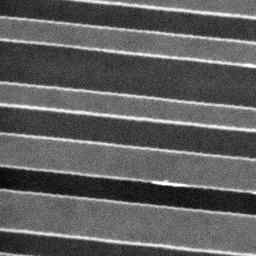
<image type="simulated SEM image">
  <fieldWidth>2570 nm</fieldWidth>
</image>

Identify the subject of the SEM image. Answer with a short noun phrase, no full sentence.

lines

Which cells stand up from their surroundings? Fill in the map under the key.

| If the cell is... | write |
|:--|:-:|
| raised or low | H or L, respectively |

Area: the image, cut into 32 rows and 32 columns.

LLLLLLLLLLLLLLLHHHHHHHHHHHHHHHHH
LLLLLLLLLLLLLLLLLLLLLLLLHHHHHHHH
HHHHLLLLLLLLLLLLLLLLLLLLLLLLLLLL
HHHHHHHHHHHHHLLLLLLLLLLLLLLLLLLL
HHHHHHHHHHHHHHHHHHHHHHHLLLLLLLLL
LLLLLLHHHHHHHHHHHHHHHHHHHHHHHHHH
LLLLLLLLLLLLLLLHHHHHHHHHHHHHHHHH
LLLLLLLLLLLLLLLLLLLLLLLLLHHHHHHH
LLLLLLLLLLLLLLLLLLLLLLLLLLLLLLLL
LLLLLLLLLLLLLLLLLLLLLLLLLLLLLLLL
HHLLLLLLLLLLLLLLLLLLLLLLLLLLLLLL
HHHHHHHHHHHHLLLLLLLLLLLLLLLLLLLL
HHHHHHHHHHHHHHHHHHHHHLLLLLLLLLLL
LLLLLHHHHHHHHHHHHHHHHHHHHHHHHHHL
LLLLLLLLLLLLLLHHHHHHHHHHHHHHHHHH
LLLLLLLLLLLLLLLLLLLLLLLLHHHHHHHH
LLLLLLLLLLLLLLLLLLLLLLLLLLLLLLLL
HHHHHHHHLLLLLLLLLLLLLLLLLLLLLLLL
HHHHHHHHHHHHHHHHHLLLLLLLLLLLLLLL
HHHHHHHHHHHHHHHHHHHHHHHHHHHLLLLL
HHHHHHHHHHHHHHHHHHHHHHHHHHHHHHHH
LLLLLLLHHHHHHHHHHHHHHHHHHHHHHHHH
LLLLLLLLLLLLLLLLLHHHHHHHHHHHHHHH
LLLLLLLLLLLLLLLLLLLLLLLLLLHHHHHH
HHHHHHHHLLLLLLLLLLLLLLLLLLLLLLLL
HHHHHHHHHHHHHHHHHLLLLLLLLLLLLLLL
HHHHHHHHHHHHHHHHHHHHHHHHHHHLLLLL
HHHHHHHHHHHHHHHHHHHHHHHHHHHHHHHH
HHHHHHHHHHHHHHHHHHHHHHHHHHHHHHHH
LLLLLLLLHHHHHHHHHHHHHHHHHHHHHHHH
LLLLLLLLLLLLLLLLLLHHHHHHHHHHHHHH
LLLLLLLLLLLLLLLLLLLLLLLLLLLHHHHH